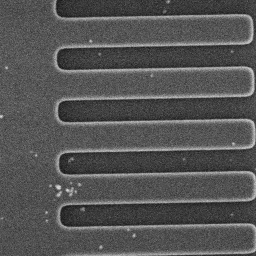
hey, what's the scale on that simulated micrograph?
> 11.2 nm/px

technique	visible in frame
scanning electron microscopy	groups of lines, slits or small figures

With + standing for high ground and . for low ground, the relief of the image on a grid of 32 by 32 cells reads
+++++++.........................
+++++++.........................
++++++++++++++++++++++++++++++++
++++++++++++++++++++++++++++++++
++++++++++++++++++++++++++++++++
+++++++++++++++++++++++++++++++.
+++++++.........................
+++++++.........................
++++++++..............+++++++++.
++++++++++++++++++++++++++++++++
++++++++++++++++++++++++++++++++
++++++++++++++++++++++++++++++++
++++++++........................
+++++++.........................
+++++++.........................
++++++++++++++++++++++++++++++++
++++++++++++++++++++++++++++++++
++++++++++++++++++++++++++++++++
+++++++++++++++++++++++++++++++.
++++++++........................
+++++++.........................
++++++++...................++++.
++++++++++++++++++++++++++++++++
++++++++++++++++++++++++++++++++
++++++++++++++++++++++++++++++++
+++++++++++.....................
++++++++........................
++++++++........................
++++++++++++++++++++++++++++++++
++++++++++++++++++++++++++++++++
++++++++++++++++++++++++++++++++
++++++++++++++++++++++++++++++++